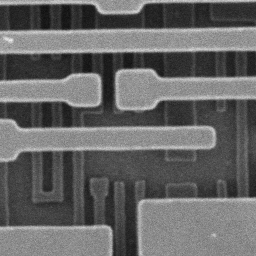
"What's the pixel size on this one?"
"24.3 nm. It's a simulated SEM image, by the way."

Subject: wiring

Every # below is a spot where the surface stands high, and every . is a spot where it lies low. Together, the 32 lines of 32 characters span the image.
####.......#######..............
.............####...............
................................
................................
################################
################################
##############..................
................................
................................
.........###...#####............
############...#################
#############..#################
#############..######...........
...............####.............
................................
##..............................
###########################.....
###########################.....
##########################......
##..............................
................................
................................
................................
................................
................................
.................###############
.................###############
.................###############
##############...###############
##############...###############
##############...###############
##############...###############